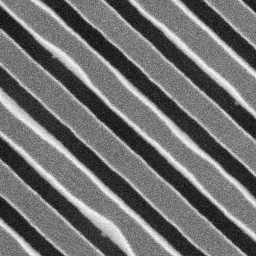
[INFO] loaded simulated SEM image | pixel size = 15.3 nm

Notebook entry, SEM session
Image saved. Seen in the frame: lines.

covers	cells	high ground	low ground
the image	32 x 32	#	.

#####....####....######...#####.
.######...#####...######...#####
..######...#####...######...####
...######...#####...######...###
#...######...#####...######...##
##...######...#####...######...#
###....#####...#####...######...
####....#####...#####...######..
#####....#####...#####...######.
..####....#####...#####....#####
...#####...#####...#####....####
....#####...#####....####....###
#....#####...#####....####....##
##....#####...#####....#####...#
###....#####...#####....#####...
####....#####...#####....#####..
#####....#####...#####....#####.
.######...#####...#####....#####
..######...#####....#####...####
...######...#####....#####...###
#...######...#####....#####...##
##...######...#####....#####...#
###...######....#####...#####...
####...######....#####...#####..
#####...######....#####...#####.
.#####....#####....#####...#####
..#####....######...#####...####
...#####....######...#####...###
#...#####....######...#####...##
##...#####....######...#####....
###....####....######...#####...
####....#####...######...#####..